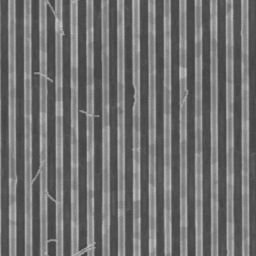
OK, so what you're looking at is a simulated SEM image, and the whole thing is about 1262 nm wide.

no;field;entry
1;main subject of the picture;parallel lines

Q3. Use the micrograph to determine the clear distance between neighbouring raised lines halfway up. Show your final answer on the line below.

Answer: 0.0444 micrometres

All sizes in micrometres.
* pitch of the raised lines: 0.0765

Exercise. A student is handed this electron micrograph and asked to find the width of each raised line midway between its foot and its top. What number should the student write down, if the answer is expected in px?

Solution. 6